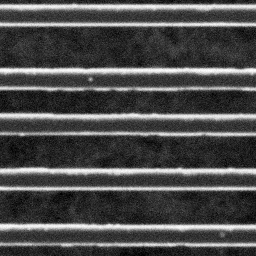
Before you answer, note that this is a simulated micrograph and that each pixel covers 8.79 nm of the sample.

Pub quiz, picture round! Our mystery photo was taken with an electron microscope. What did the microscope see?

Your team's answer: lines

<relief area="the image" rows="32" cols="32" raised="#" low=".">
................................
################################
################################
................................
................................
................................
................................
................................
................................
################################
################################
................................
................................
................................
#######........###.#..........#.
################################
################################
................................
................................
................................
................................
################################
################################
################################
................................
................................
................................
................................
################################
################################
################################
................................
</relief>